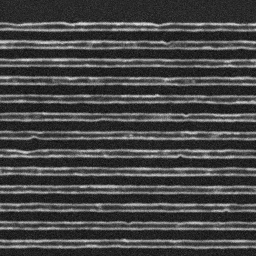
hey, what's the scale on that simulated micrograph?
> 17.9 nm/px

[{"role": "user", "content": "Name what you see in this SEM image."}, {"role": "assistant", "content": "parallel lines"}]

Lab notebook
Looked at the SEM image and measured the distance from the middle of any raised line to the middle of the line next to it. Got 323 nm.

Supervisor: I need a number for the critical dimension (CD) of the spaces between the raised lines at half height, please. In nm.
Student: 208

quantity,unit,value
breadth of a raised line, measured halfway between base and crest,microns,0.127